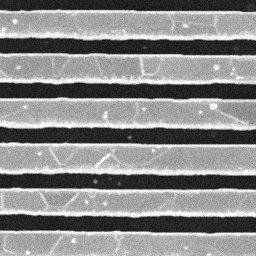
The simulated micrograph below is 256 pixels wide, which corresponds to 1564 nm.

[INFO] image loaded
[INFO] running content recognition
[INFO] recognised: lines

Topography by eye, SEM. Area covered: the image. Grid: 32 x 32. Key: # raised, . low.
................................
###############################.
################################
################################
################################
................................
................................
################################
################################
################################
................................
................................
######################.#####....
################################
################################
################################
................................
................................
################################
################################
################################
###.###....#####################
................................
................................
################################
################################
################################
................................
................................
################################
################################
################################